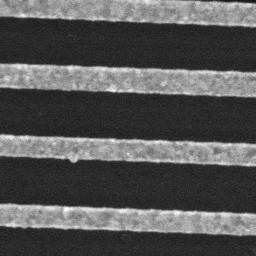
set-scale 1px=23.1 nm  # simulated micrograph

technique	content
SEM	lines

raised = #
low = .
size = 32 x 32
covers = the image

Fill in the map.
################################
################################
..............##################
................................
................................
................................
................................
................................
#############...................
################################
################################
.................###############
................................
................................
................................
................................
................................
##############..................
################################
.###############################
............................####
................................
................................
................................
................................
................................
#######################.........
################################
..........######################
................................
................................
................................